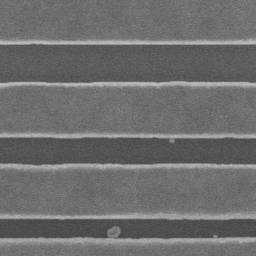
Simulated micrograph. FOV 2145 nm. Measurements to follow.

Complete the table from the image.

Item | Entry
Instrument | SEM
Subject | lines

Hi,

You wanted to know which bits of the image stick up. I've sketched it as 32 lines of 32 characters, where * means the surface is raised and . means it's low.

********************************
********************************
********************************
********************************
********************************
................................
................................
................................
................................
................................
********************************
********************************
********************************
********************************
********************************
********************************
********************************
................................
................................
................................
................................
********************************
********************************
********************************
********************************
********************************
********************************
................................
................................
................................
********************************
********************************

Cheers